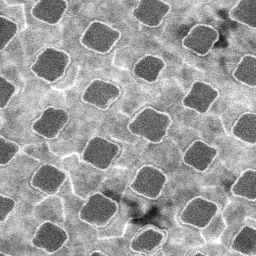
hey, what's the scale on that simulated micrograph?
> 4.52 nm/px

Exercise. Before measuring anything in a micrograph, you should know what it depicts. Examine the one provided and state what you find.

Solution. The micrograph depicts a regular array of raised bodies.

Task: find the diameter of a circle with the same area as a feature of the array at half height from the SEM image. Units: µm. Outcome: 0.145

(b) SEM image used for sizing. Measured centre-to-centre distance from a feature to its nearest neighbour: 257 nanometers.